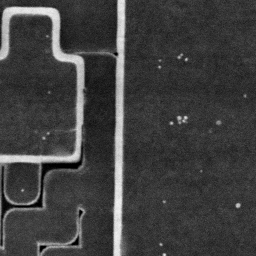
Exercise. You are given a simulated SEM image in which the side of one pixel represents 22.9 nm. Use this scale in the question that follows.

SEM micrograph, wiring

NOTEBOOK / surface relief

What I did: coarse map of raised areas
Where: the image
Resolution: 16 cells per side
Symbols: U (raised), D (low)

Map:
DDDDDDDDUUUUUUUU
UUUDDDDDUUUUUUUU
UUUDDDDDUUUUUUUU
UUUUDDDDUUUUUUUU
UUUUUDDUUUUUUUUU
UUUUUDDUUUUUUUUU
UUUUUDDUUUUUUUUU
UUUUUDDUUUUUUUUU
UUUUUDDUUUUUUUUU
UUUUUDDUUUUUUUUU
DDDDDDDUUUUUUUUU
DDDDDDDUUUUUUUUU
DDDDDDDUUUUUUUUU
DDDDDDDUUUUUUUUU
DDDDDDDUUUUUUUUU
DDDDDDDUUUUUUUUU